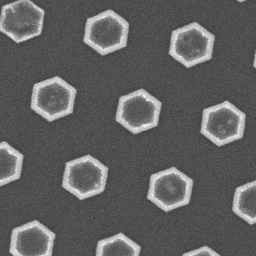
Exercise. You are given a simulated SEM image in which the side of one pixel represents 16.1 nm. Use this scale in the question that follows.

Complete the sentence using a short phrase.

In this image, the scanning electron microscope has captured raised bodies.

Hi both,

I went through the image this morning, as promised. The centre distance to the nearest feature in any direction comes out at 1360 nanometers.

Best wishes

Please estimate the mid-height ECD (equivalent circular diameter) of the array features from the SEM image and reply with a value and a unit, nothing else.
0.636 microns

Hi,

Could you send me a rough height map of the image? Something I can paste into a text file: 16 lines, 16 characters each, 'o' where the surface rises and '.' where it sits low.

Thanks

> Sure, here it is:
................
......oo........
......oo...oo...
...........oo...
................
..oo............
..oo....oo......
........oo...oo.
.............oo.
o...............
o...oo..........
....oo...ooo....
..........oo...o
...............o
.oo.............
.oo...oo........